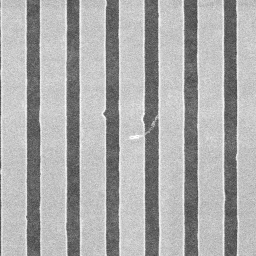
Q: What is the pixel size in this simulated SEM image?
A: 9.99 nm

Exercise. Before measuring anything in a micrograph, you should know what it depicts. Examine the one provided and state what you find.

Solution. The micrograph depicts parallel lines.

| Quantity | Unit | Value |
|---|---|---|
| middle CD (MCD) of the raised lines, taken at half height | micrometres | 0.252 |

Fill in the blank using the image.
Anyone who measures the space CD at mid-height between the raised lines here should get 0.14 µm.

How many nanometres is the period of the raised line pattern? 393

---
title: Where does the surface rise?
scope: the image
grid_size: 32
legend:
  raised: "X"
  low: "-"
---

XXX--XXX--XXX--XXX--XXX--XXX--XX
XXX--XXX--XXX--XXX--XXX--XXX--XX
XXX--XXX--XXX--XXX--XXX--XXX--XX
XXX--XXX--XXX--XXX--XXX--XXX--XX
XXX--XXX--XXX--XXX--XXX--XXX--XX
XXX--XXX--XXX--XXX--XXX--XXX--XX
XXX--XXX--XXX--XXX--XXX--XXX--XX
XXX--XXX--XXX--XXX--XXX--XXX--XX
XXX--XXX--XXX--XXX--XXX--XXX--XX
XXX--XXX--XXX--XXX--XXX--XXX--XX
XXX--XXX--XXX--XXX--XXX--XXX--XX
XXX--XXX--XXX--XXX--XXX--XXX--XX
XXX--XXX--XXX--XXX--XXX--XXX--XX
XXX--XXX--XXX--XXX--XXX--XXX--XX
XXX--XXX--XXX--XXX--XXX--XXX--XX
XXX--XXX--XXX--XXX--XXX--XXX--XX
XXX--XXX--XXX--XXX--XXX--XXX--XX
XXX--XXX--XXX--XXX--XXX--XXX--XX
XXX--XXX--XXX--XXX--XXX--XXX--XX
XXX--XXX--XXX--XXX--XXX--XXX--XX
XXX--XXX--XXX--XXX--XXX--XXX--XX
XXX--XXX--XXX--XXX--XXX--XXX--XX
XXX--XXX--XXX--XXX--XXX--XXX--XX
XXX--XXX--XXX--XXX--XXX--XXX--XX
XXX--XXX--XXX--XXX--XXX--XXX--XX
XXX--XXX--XXX--XXX--XXX--XXX--XX
XXX--XXX--XXX--XXX--XXX--XXX--XX
XXX--XXX--XXX--XXX--XXX--XXX--XX
XXX--XXX--XXX--XXX--XXX--XXX--XX
XXX--XXX--XXX--XXX--XXX--XXX--XX
XXX--XXX--XXX--XXX--XXX--XXX--XX
XXX--XXX--XXX--XXX--XXX--XXX--XX